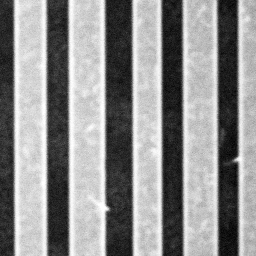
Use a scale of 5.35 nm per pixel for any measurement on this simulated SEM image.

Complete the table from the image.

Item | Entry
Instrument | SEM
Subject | parallel lines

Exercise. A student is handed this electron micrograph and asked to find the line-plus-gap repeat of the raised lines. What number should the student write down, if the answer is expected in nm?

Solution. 303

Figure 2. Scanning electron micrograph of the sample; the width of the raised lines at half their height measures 171 nm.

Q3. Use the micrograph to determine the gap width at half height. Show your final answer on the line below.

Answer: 127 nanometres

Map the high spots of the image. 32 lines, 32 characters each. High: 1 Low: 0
00111100011110000111000111100011
00111100011110000111000111100011
00111100011110000111000111100011
00111100011110000111000111100011
00111100011110000111000111100011
00111100011110000111000111100011
00111100011110000111000111100011
00111100011110000111000111100011
00111100011110000111000111100011
00111100011110000111000111100011
00111100011110000111000111100011
00111100011110000111000111100011
00111100011110000111000111100011
00111100011110000111000111100011
00111100011110000111000111100011
00111100011110000111000111100011
00111100011110000111000111100011
00111100011110000111000111100011
00111100011110000111000111100011
00111100011110000111000111100011
00111100011110000111000111100011
00111100011110000111000111100011
00111100011110000111000111100011
00111100011110000111000111100011
00111100011110000111000111100011
00111100011110000111000111100011
00111100011110000111000111100011
00111100011110000111000111100011
00111100011110000111000111100011
00111100011110000111000111100011
00111100011110000111000111100011
00111100011110000111000111100011